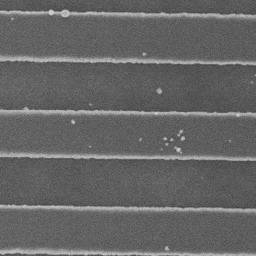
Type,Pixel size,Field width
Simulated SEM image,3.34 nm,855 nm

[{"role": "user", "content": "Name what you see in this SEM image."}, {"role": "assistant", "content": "lines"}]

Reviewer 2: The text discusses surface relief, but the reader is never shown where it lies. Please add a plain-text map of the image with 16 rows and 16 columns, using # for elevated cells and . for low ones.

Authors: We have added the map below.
................
################
################
################
................
................
................
################
################
################
................
................
................
################
################
################